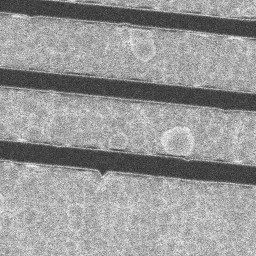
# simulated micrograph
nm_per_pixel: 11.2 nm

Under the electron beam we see one or a few lines or trenches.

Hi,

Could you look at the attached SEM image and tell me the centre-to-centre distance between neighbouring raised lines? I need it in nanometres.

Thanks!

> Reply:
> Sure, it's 816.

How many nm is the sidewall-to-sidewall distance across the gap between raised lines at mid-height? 584